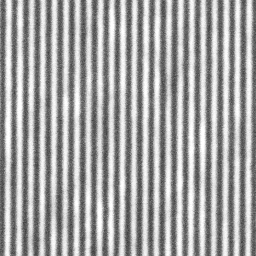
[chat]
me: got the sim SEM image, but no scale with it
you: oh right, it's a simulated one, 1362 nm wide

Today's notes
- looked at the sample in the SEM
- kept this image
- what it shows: parallel lines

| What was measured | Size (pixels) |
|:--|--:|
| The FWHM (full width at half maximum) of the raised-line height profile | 3.76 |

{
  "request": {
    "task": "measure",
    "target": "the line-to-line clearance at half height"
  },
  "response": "39.9 nanometers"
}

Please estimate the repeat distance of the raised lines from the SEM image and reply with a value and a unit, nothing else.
61 nanometers